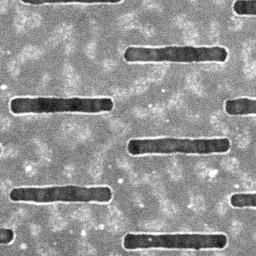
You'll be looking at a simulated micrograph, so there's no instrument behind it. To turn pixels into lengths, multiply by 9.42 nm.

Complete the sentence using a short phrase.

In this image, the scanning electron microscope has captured holes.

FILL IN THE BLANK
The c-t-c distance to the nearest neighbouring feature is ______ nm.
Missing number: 864